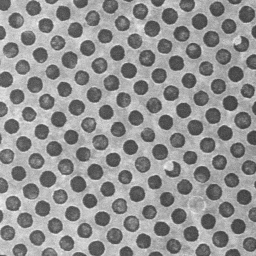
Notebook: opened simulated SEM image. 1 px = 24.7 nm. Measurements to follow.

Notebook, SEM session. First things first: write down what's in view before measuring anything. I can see a regular array of holes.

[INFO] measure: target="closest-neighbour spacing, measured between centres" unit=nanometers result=516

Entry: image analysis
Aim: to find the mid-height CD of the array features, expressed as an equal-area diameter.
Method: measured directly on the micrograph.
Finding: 401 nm